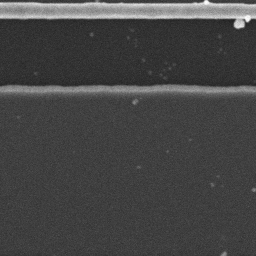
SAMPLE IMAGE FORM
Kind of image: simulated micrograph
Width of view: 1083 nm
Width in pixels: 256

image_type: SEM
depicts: lines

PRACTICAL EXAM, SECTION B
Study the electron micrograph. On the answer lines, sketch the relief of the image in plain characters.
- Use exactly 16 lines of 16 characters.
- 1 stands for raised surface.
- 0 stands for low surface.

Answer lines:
1111111111111111
0000000000000000
0000000000000000
0000000000000000
0000000000000000
0000000000000000
1111111111111111
1111111111111111
1111111111111111
1111111111111111
1111111111111111
1111111111111111
1111111111111111
1111111111111111
1111111111111111
1111111111111111